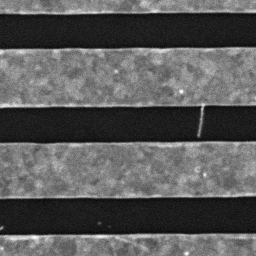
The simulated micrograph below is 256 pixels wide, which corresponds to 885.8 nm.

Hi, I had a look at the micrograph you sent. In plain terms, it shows wiring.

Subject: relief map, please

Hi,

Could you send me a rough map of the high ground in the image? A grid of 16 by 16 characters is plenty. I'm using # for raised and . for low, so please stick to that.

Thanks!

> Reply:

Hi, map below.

################
................
................
################
################
################
################
................
................
################
################
################
................
................
................
#.##############